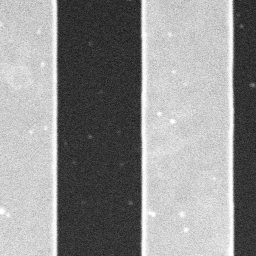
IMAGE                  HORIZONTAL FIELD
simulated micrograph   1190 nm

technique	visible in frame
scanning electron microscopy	wiring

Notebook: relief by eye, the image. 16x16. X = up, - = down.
XXX------XXXXX--
XXX------XXXXX--
XXX------XXXXX--
XXX------XXXXX--
XXX------XXXXX--
XXX------XXXXX--
XXX------XXXXX--
XXX------XXXXXX-
XXX------XXXXX--
XXX------XXXXX--
XXX------XXXXX--
XXX------XXXXX--
XXX------XXXXX--
XXX------XXXXXX-
XXX------XXXXXX-
XXX------XXXXXX-